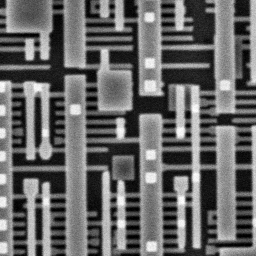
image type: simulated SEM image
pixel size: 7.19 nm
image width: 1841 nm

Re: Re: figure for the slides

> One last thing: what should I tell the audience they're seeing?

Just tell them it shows wiring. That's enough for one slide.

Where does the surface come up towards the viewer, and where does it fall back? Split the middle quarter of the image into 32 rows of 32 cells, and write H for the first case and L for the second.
HHHHHLLLLHHLLLLLLLLHHHHHLLLLLLLL
LLLLLLLLLHHLLLLLLLLHHHHHLLLLLLLL
LLLLLLLLHHHHHHHHHLLHHHHHLLLLLLLL
HHHHHLLLLHHHHHHHHLLHHHHHLLLLLLLL
HHHHHLLLLHHHHHHHHLLHHHHHLLLLLLLL
HHHHHLLLLHHHHHHHHLLHHHHHLLLLHLLL
HHHHHLLLLHHHHHHHHLLHHHHHLLLLHHLL
HHHHHLLLLHHHHHHHHLLHHHHHLLLLHHLL
HHHHHLLLLHHHHHHHHLLLLLLLLLLLHHLL
HHHHHLLLLHHHHHHHHLLLLLLLLLLLHHLL
HHHHHLLLLHHHHHHHHLLLLLLLLLLLHHLL
HHHHHLLLLHHHHHHHHLLLLLLLLLLLHHLL
HHHHHLLLLLLLLLLLLLLLLLLLLLLLHHLL
HHHHHLLLLLLLLLLLLLLHHHHHLLLLHHLL
HHHHHLLLLLLLLHHLLLLHHHHHLLLLHHLL
HHHHHLLLLLLLLHHLLLLHHHHHLLLLHHLL
HHHHHLLLLLLLLHHLLLLHHHHHLLLLHHLL
HHHHHLLLLLLLLHHLLLLHHHHHLLLLHHLL
HHHHHLLLLLLLLHHLLLLHHHHHLLLLHHLL
HHHHHLLLLLLLLLLLLLLHHHHHLLLLLLLL
HHHHHLLLLLLLLLLLLLLHHHHHLLLLLLLL
HHHHHLLLLLLLLLLLLLLHHHHHLLLLLLLL
HHHHHLLLLLLLLLLLLLLHHHHHLLLLLLLL
HHHHHLLLLLLLLLLLLLLHHHHHLLLLLLLL
HHHHHLLLLLLLLLLLLLLHHHHHLLLLLLLL
HHHHHLLLLLLLLLLLLLLHHHHHLLLLLLLL
LHHHHLLLLLLLLLLLLLLHHHHHLLLLLLLL
LHHHHLLLLLHLLLLLLLLHHHHHLLLLLLLL
LHHHHLLLLLHLLLLLLLLHHHHHLLLLHHHL
LHHHHLLLLLHLLHHLLLLHHHHHLLLLHHHL
LHHHHLLLLLHLLHHLLLLHHHHHLLLLHHHL
LHHHHLLLLLHLLHHLLLLHHHHHLLLLHHHL